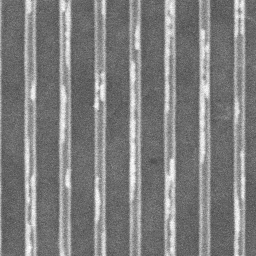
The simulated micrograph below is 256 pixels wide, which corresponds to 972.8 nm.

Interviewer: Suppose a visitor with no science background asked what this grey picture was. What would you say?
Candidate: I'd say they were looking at parallel lines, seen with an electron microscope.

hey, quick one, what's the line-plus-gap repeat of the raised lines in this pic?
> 0.133 µm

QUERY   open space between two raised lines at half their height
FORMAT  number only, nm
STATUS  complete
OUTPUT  96.1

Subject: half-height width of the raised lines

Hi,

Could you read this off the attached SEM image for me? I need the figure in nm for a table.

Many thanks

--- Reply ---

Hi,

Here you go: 36.6